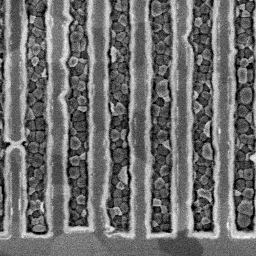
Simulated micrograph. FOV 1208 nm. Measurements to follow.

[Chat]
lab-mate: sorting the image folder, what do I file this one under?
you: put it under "parallel lines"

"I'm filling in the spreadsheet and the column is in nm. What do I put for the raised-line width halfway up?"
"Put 80.3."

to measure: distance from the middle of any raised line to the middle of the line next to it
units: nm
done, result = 196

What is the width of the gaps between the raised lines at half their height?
116 nm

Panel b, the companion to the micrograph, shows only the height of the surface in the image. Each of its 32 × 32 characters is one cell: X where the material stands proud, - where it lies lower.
-XX---XX---XX---XXX---XX---XX---
-XX---XX---XX---XX----XX---XX---
-XX---XXX--XX----X----XX---XX---
-XX---XX---XX----XX---XX---XX---
-XX---XX---XX----XX---X----XX---
-XX---XX---XX----XX---XX---XX---
-XX---XX---XX----XX---XX---XX---
-XX---XX---XX---XXX---XX---XX---
-XX---XX---XX---XXX---XX---XX---
-XX---XX---XX----XX---XX---XX---
-XX---XX---XX----XX---XX---XX---
-XX---XX---XX----XX---XX---XX---
-XX---XX---XX----XX---XX---XX---
-XX---XX---XX---XXX---XX---XX---
-XX---XX---XX---XX----XX---XX---
-XX---XX---XX---XXX---XX---XX---
-XX---XX---XX---XXX---XX---XX---
-XX---XX---XX---XX----XX---XX---
-XX---XX---XX---XXX---XX---XX---
-XX---XX---XXX---XX---XX---XX---
-XX---XX---XXX--XXX---XX---XX---
-XX---XX---XXX--XXX---XX---XX---
-XX---XX---XX---XX----XX---XX---
-XX---XX---XX----XX---XX---XX---
-XX---XX---XX----XX---XX---XX---
-XX---XX---XX---XXX---XX---XX---
-XX---XX---XX----XX---XX---XX---
-XX---XX---XX----X----XX---XX---
-XX---XXX--XXX---XX---XX---XX---
XXXXXXXXXXXXXXXXXXXXXXXXXXXXXXXX
XXXXXXXXXXXXXXXXXXXXXXXXXXXXXXXX
XXXXXXXXXXXXXXXXXXXXXXXXXXXXXXXX